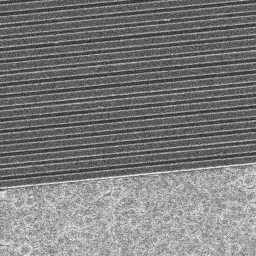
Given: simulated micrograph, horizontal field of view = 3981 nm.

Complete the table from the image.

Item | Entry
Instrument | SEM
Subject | parallel lines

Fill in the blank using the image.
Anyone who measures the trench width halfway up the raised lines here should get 58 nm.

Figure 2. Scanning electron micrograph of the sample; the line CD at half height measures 116 nanometers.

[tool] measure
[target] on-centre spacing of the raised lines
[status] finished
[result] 181 nm